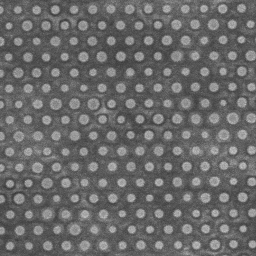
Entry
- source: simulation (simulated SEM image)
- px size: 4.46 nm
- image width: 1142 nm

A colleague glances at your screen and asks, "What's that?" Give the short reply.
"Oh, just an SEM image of a regular array of raised bodies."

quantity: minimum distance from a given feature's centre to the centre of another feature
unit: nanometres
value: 79.9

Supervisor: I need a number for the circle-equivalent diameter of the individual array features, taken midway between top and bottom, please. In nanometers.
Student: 35.9